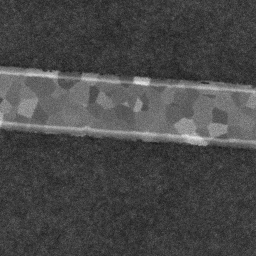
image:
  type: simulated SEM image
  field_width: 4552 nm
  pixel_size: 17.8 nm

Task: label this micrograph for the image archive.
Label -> one or a few lines or trenches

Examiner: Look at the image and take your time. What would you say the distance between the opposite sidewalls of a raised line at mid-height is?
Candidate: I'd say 0.887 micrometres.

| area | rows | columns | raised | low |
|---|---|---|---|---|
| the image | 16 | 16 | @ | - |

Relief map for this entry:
----------------
----------------
----------------
----------------
----------------
@@@@@@@@@@@@----
@@@@@@@@@@@@@@@@
@@@@@@@@@@@@@@@@
-----------@@@@@
----------------
----------------
----------------
----------------
----------------
----------------
----------------